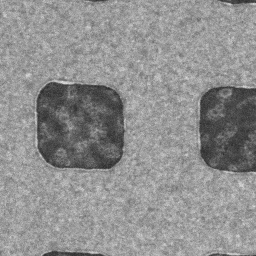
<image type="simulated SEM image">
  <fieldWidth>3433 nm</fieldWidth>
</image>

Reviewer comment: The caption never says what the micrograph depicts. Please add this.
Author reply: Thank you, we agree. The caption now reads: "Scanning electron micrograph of holes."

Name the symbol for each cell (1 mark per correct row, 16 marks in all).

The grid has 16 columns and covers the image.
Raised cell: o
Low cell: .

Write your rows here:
oooooooooooooooo
oooooooooooooooo
oooooooooooooooo
oooooooooooooooo
oooooooooooooooo
ooo....oooooo...
oo......oooo....
oo......oooo....
oo......oooo....
oo......ooooo...
oooo...oooooo...
oooooooooooooooo
oooooooooooooooo
oooooooooooooooo
oooooooooooooooo
oooooooooooooooo